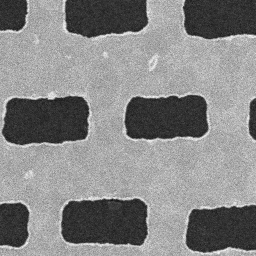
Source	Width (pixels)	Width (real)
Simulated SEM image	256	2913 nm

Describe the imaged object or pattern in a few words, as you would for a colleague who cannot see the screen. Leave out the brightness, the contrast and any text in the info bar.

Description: holes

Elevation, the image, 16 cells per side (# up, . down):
..##.....##.....
..##.....###....
################
################
################
################
.....###.....###
......##.....###
.....###.....###
################
################
################
######.#.#######
..##.....###....
..##.....###....
############....